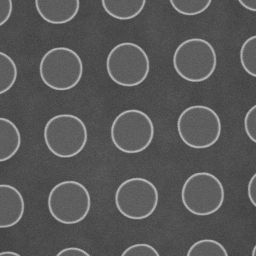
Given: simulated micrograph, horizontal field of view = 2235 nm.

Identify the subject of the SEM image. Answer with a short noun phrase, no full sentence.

an array of small figures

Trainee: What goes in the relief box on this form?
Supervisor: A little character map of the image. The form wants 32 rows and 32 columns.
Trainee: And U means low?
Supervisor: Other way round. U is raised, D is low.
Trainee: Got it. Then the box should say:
UDDDDUUUUUDDDUUUUUDDDUUUUUDDDDUU
UDDDDUUUUUDDDUUUUDDDDDUUUDDDDDDD
UDDDDDUUUDDDDDDDDDDDDDDDDDDDDDDD
DDDDDDDDDDDDDDDDDDDDDDDDDDDDDDDD
DDDDDDDDDDDDDDDDDDDDDDDDDDDDDDDD
DDDDDDDDDDDDDDDUUDDDDDDUUUDDDDUU
DDDDDDUUUDDDDDUUUUDDDDUUUUUDDDUU
UDDDDUUUUUDDDUUUUUDDDDUUUUUDDDUU
UUDDDUUUUUDDDUUUUUUDDDUUUUUDDDDU
UUDDDUUUUUDDDDUUUUDDDDDUUUDDDDDD
UUDDDDUUUDDDDDDUUDDDDDDDDDDDDDDD
UDDDDDDDDDDDDDDDDDDDDDDDDDDDDDDD
DDDDDDDDDDDDDDDDDDDDDDDDDDDDDDDD
DDDDDDDDDDDDDDDDDDDDDDDDUUDDDDDD
DDDDDDDUUDDDDDDUUUDDDDDUUUUDDDDU
UUDDDDUUUUDDDDUUUUUDDDUUUUUUDDDU
UUDDDDUUUUUDDDUUUUUDDDUUUUUDDDDU
UUDDDDUUUUUDDDUUUUUDDDDUUUUDDDDD
UUDDDDUUUUDDDDDUUUDDDDDDDDDDDDDD
UDDDDDDUUDDDDDDDDDDDDDDDDDDDDDDD
DDDDDDDDDDDDDDDDDDDDDDDDDDDDDDDD
DDDDDDDDDDDDDDDDDDDDDDDDDDDDDDDD
DDDDDDDDDDDDDDDDUUDDDDDUUUUDDDDU
UUDDDDDUUUUDDDDUUUUDDDDUUUUUDDDU
UUUDDDUUUUUDDDUUUUUUDDDUUUUUDDDU
UUUDDDUUUUUDDDDUUUUUDDDUUUUUDDDD
UUUDDDUUUUUDDDDUUUUDDDDDUUUDDDDD
UUDDDDDUUUDDDDDDDDDDDDDDDDDDDDDD
DDDDDDDDDDDDDDDDDDDDDDDDDDDDDDDD
DDDDDDDDDDDDDDDDDDDDDDDDDDDDDDDD
DDDDDDDDDDDDDDDDDDDDDDDDUUUDDDDD
DDDDDDDDUUUDDDDDUUUUDDDDUUUUDDDD